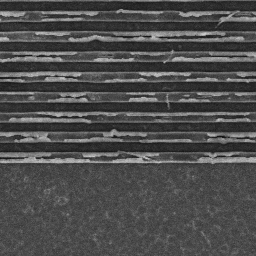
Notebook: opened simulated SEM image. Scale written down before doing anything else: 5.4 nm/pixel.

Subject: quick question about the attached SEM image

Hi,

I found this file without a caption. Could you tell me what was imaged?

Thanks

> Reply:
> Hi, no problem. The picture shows parallel lines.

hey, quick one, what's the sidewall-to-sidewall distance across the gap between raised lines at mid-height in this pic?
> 56 nanometres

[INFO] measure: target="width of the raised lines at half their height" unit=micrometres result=0.0554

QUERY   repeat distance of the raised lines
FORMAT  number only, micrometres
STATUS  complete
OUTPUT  0.109